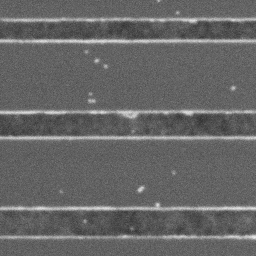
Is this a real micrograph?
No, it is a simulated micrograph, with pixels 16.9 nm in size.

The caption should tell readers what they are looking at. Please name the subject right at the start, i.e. lines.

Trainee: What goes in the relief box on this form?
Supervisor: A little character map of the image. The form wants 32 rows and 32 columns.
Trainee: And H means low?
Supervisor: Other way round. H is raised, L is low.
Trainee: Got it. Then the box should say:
HHHHHHHHHHHHHHHHHHHHHHHHHHHHHHHH
HHHHHHHHHHHHHHHHHHHHHHHHHHHHHHHH
HHHHHHHHLLHHHLLLLLHHHLLHHLLLLHLL
LLLLLLLLLLLLLLLLLLLLLLLLLLLLLLLL
LLLLLLLLLLLLLLLLLLLLLLLLLLLLLLLL
HHHHHHHHHHHHHHHHHHHHHHHHHHHHHHHH
HHHHHHHHHHHHHHHHHHHHHHHHHHHHHHHH
HHHHHHHHHHHHHHHHHHHHHHHHHHHHHHHH
HHHHHHHHHHHHHHHHHHHHHHHHHHHHHHHH
HHHHHHHHHHHHHHHHHHHHHHHHHHHHHHHH
HHHHHHHHHHHHHHHHHHHHHHHHHHHHHHHH
HHHHHHHHHHHHHHHHHHHHHHHHHHHHHHHH
HHHHHHHHHHHHHHHHHHHHHHHHHHHHHHHH
HHHHHHHHHHHHHHHHHHHHHHHHHHHHHHHH
LLLLLLLLLLLLLLLLLLLLLLLLLLLLLLLL
LLLLLLLLLLLLLLLLLLLLLLLLLLLLLLLL
LLLLLLLLLLLLLLLLLLLLLLLLLLLLLLLL
HHHHHHHHHHHHHHHHHHHHHHHHHHHHHHHH
HHHHHHHHHHHHHHHHHHHHHHHHHHHHHHHH
HHHHHHHHHHHHHHHHHHHHHHHHHHHHHHHH
HHHHHHHHHHHHHHHHHHHHHHHHHHHHHHHH
HHHHHHHHHHHHHHHHHHHHHHHHHHHHHHHH
HHHHHHHHHHHHHHHHHHHHHHHHHHHHHHHH
HHHHHHHHHHHHHHHHHHHHHHHHHHHHHHHH
HHHHHHHHHHHHHHHHHHHHHHHHHHHHHHHH
HHHHHHHHHHHHHHHHHHHHHHHHHHHHHHHH
LLLLLLLLLLLLLLLLLLLLLLLLLLLLLLLL
LLLLLLLLLLLLLLLLLLLLLLLLLLLLLLLL
LLLLLLLLLLLLLLLLLLLLLLLLLLLLLLLL
LLLLLLLLLLLLLLLLLLLLLLLLLLLLLLLL
HHHHHHHHHHHHHHHHHHHHHHHHHHHHHHHH
HHHHHHHHHHHHHHHHHHHHHHHHHHHHHHHH